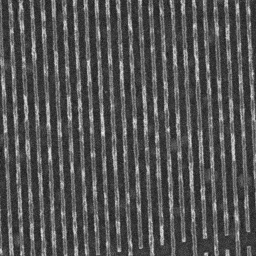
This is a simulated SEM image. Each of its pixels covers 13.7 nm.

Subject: parallel lines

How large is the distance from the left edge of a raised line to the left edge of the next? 148 nm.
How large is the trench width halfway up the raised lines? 101 nm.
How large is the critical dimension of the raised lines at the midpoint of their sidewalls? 44.4 nm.